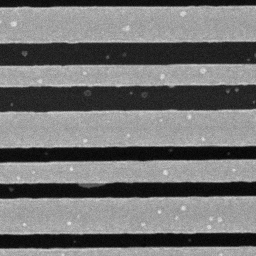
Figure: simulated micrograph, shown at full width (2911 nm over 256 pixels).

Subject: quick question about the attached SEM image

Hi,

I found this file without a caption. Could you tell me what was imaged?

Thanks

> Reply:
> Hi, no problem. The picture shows lines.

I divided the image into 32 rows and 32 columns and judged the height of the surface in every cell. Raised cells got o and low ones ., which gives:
................................
oooooooooooooooooooooooooooooooo
oooooooooooooooooooooooooooooooo
oooooooooooooooooooooooooooooooo
oooooooooooooooooooooooooooooooo
................................
................................
................................
oooooooooooooooooooooooooooooooo
oooooooooooooooooooooooooooooooo
oooooooooooooooooooooooooooooo..
................................
................................
................................
oooooooooooooooooooooooooooooooo
oooooooooooooooooooooooooooooooo
oooooooooooooooooooooooooooooooo
oooooooooooooooooooooooooooooooo
................................
................................
oooooooooooooooooooooooooooooooo
oooooooooooooooooooooooooooooooo
oooooooooooooooooooooooooooooooo
................................
................................
oooooooooooooooooooooooooooooooo
oooooooooooooooooooooooooooooooo
oooooooooooooooooooooooooooooooo
oooooooooooooooooooooooooooooooo
................................
................................
oooooooooooooooooooooooooooooooo